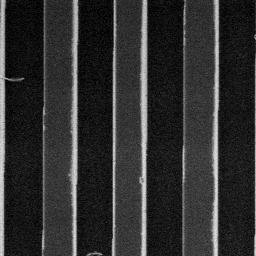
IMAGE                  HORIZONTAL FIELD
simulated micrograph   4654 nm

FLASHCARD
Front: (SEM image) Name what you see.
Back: lines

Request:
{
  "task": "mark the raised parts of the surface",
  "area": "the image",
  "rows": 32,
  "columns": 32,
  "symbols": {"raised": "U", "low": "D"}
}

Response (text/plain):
DDDDDDUUUUDDDDUUUUDDDDDUUUUDDDDD
DDDDDDUUUUDDDDUUUUDDDDDUUUUDDDDD
DDDDDDUUUUDDDDUUUUDDDDDUUUUDDDDD
DDDDDDUUUUDDDDUUUUDDDDDUUUUDDDDD
DDDDDDUUUUDDDDUUUUDDDDDUUUUDDDDD
DDDDDDUUUUDDDDUUUUDDDDDUUUUDDDDD
DDDDDDUUUUDDDDUUUUDDDDDUUUUDDDDD
DDDDDDUUUUDDDDUUUUDDDDDUUUUDDDDD
DDDDDDUUUUDDDDUUUUDDDDDUUUUDDDDD
UDDDDDUUUUDDDDUUUUDDDDDUUUUDDDDD
DDDDDDUUUUDDDDUUUUDDDDDUUUUDDDDD
DDDDDDUUUUDDDDUUUUDDDDDUUUUDDDDD
DDDDDDUUUUDDDDUUUUDDDDDUUUUDDDDD
DDDDDUUUUDDDDDUUUUDDDDDUUUUDDDDD
DDDDDUUUUDDDDDUUUUDDDDDUUUUDDDDD
DDDDDUUUUDDDDDUUUUDDDDDUUUUDDDDD
DDDDDUUUUDDDDDUUUUDDDDDUUUUDDDDD
DDDDDUUUUDDDDDUUUUDDDDDUUUUDDDDD
DDDDDUUUUDDDDDUUUUDDDDDUUUUDDDDD
DDDDDUUUUDDDDDUUUUDDDDDUUUUDDDDD
DDDDDUUUUDDDDDUUUUDDDDDUUUUDDDDD
DDDDDUUUUDDDDDUUUUDDDDDUUUUDDDDD
DDDDDUUUUDDDDDUUUUDDDDDUUUUDDDDD
DDDDDUUUUDDDDDUUUUDDDDDUUUUDDDDD
DDDDDUUUUDDDDDUUUUDDDDDUUUUDDDDD
DDDDDUUUUDDDDDUUUUDDDDDUUUUDDDDD
DDDDDUUUUDDDDDUUUUDDDDDUUUUDDDDD
DDDDDUUUUDDDDDUUUUDDDDDUUUUDDDDD
DDDDDUUUUDDDDDUUUUDDDDDUUUUDDDDD
DDDDDUUUUDDDDDUUUUDDDDDUUUUDDDDD
DDDDDUUUUDDDDDUUUUDDDDDUUUUDDDDD
DDDDDUUUUDDDDDUUUUDDDDDUUUUDDDDD